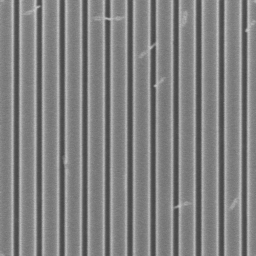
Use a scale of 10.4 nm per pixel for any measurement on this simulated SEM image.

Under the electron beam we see parallel lines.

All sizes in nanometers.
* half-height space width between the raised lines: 72.8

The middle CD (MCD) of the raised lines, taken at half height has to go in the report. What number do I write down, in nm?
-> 164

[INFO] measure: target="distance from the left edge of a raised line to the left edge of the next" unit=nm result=237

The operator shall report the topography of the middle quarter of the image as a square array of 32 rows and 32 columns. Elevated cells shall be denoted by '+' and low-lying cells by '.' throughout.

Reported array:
++++..++++..++++..+++..++++..+++
++++..++++..++++..+++..++++..+++
++++..++++..++++..+++..++++..+++
++++..++++..++++..+++..++++..+++
++++..++++..++++..+++..++++..+++
++++..++++..++++..+++..++++..+++
++++..++++..++++..+++..++++..+++
++++..++++..++++..+++..++++..+++
++++..++++..++++..+++..++++..+++
++++..++++..++++..+++..++++..+++
++++..++++..++++..+++..++++..+++
++++..++++..++++..+++..++++..+++
++++..++++..++++..+++..++++..+++
++++..++++..++++..+++..++++..+++
++++..++++..++++..+++..++++..+++
++++..++++..++++..+++..++++..+++
++++..++++..++++..+++..++++..+++
++++..++++..++++..+++..++++..+++
++++..++++..++++..+++..++++..+++
++++..++++..++++..+++..++++..+++
++++..++++..++++..+++..++++..+++
++++..++++..++++..+++..++++..+++
++++..++++..+++...+++..++++..+++
++++..++++..+++...+++..++++..+++
++++..++++..+++...+++..++++..+++
++++..++++..+++...+++..++++..+++
++++..++++..+++..++++..++++..+++
++++..++++..+++..++++..++++..+++
++++..++++..+++..++++..++++..+++
++++..++++..+++..++++..++++..+++
++++..++++..+++..++++..++++..+++
++++..++++..+++..++++..++++..+++